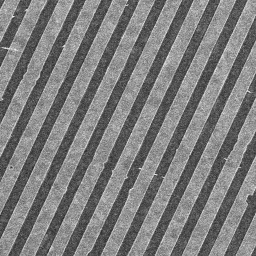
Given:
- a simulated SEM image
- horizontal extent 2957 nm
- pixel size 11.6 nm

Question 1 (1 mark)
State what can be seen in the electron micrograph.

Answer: parallel lines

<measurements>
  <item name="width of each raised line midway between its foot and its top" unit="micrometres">0.158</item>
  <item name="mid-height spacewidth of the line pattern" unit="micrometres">0.127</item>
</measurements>